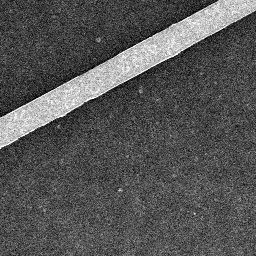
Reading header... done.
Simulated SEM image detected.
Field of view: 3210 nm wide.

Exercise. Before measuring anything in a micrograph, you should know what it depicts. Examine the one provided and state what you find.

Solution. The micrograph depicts one or a few lines or trenches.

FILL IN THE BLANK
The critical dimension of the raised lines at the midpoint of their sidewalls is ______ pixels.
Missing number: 26